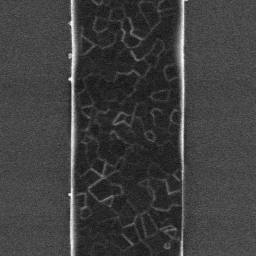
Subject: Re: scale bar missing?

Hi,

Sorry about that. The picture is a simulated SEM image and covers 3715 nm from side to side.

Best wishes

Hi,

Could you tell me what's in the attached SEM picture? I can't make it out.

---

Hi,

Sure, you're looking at wiring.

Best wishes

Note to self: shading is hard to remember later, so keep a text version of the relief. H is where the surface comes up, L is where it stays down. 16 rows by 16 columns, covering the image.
LLLLHHHHHHHLLLLL
LLLLHHHHHHHLLLLL
LLLLLHHHHHHLLLLL
LLLLLHHHHHHLLLLL
LLLLHHHHHHHLLLLL
LLLLHHHHHHHLLLLL
LLLLHHHHHHHLLLLL
LLLLHHHHHHHLLLLL
LLLLHHHHHHHLLLLL
LLLLHHHHHHHLLLLL
LLLLHHHHHHHLLLLL
LLLLHHHHHHHLLLLL
LLLLHHHHHHHLLLLL
LLLLHHHHHHHLLLLL
LLLLHHHHHHHLLLLL
LLLLHHHHHHHLLLLL